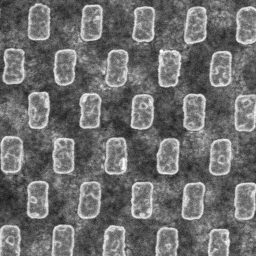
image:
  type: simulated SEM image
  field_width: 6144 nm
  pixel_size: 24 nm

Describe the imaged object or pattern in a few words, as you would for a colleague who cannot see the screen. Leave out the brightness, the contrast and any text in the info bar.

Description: a regular array of raised bodies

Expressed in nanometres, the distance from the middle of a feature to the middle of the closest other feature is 1210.